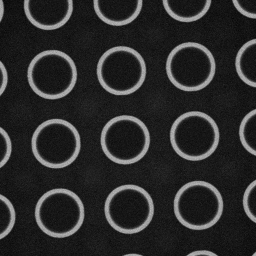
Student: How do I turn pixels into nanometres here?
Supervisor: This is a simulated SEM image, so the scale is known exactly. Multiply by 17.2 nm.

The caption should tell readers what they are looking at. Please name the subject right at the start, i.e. an array of small figures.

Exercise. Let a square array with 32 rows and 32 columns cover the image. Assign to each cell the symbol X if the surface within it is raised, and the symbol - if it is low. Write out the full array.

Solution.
---XXXXXX---XXXXXX--XXXXXX---XXX
---XXXXXX---XXXXX----XXXXX----XX
----XXXX-----XXXX-----XX--------
-----XX-------------------------
--------------------------------
-----------------------XX------X
-----XXX-----XXXX----XXXXX----XX
----XXXXX---XXXXXX---XXXXXX--XXX
X---XXXXX---XXXXXX---XXXXXX--XXX
X---XXXXXX--XXXXXX---XXXXXX---XX
X---XXXXX----XXXXX----XXXX-----X
----XXXXX-----XXX---------------
--------------------------------
--------------------------------
---------------X-------XXX-----X
-----XXXX----XXXXX----XXXXX---XX
X---XXXXXX---XXXXXX--XXXXXX---XX
X---XXXXXX---XXXXXX--XXXXXX---XX
X---XXXXXX---XXXXXX---XXXXX----X
X---XXXXXX---XXXXX-----XXX------
X----XXXX------X----------------
--------------------------------
--------------------------------
---------------XXX-----XXXX----X
-----XXXXX----XXXXX---XXXXXX--XX
X----XXXXX---XXXXXX---XXXXXX--XX
XX--XXXXXX---XXXXXX---XXXXXX---X
XX---XXXXX---XXXXXX---XXXXX----X
XX---XXXXX----XXXX------XX------
X-----XXX-----------------------
--------------------------------
------------------------XX------